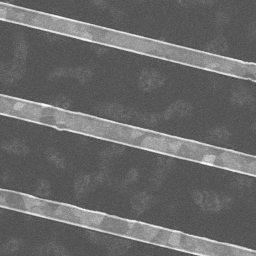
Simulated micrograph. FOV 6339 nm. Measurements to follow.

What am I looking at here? one or a few lines or trenches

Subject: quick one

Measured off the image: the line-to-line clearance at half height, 73 pixels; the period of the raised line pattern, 2250 nanometres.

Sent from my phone